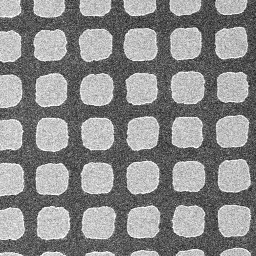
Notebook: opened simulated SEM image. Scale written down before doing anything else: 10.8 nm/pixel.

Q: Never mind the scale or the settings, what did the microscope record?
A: a regular array of raised bodies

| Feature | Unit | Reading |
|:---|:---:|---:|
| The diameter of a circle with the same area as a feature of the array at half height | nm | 361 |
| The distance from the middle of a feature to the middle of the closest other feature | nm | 475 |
